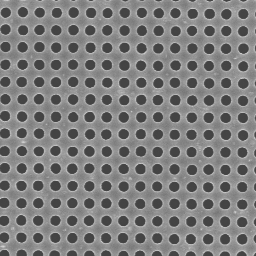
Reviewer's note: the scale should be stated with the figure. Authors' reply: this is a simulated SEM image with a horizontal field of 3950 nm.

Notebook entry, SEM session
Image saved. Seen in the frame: a regular array of holes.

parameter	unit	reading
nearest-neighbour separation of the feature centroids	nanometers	257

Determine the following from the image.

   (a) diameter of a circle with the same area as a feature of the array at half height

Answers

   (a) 0.163 microns